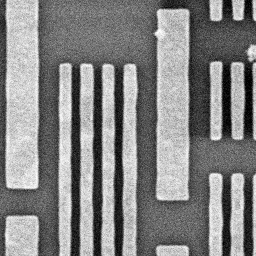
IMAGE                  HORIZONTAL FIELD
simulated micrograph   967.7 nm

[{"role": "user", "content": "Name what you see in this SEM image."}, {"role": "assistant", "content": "wiring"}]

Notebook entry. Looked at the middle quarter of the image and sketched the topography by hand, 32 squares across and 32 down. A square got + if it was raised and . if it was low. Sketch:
++..+++...++...+++.....++++++++.
++..+++...++...+++.....++++++++.
++..+++...++...+++.....++++++++.
++..+++...++...+++.....++++++++.
++..+++...++...+++.....++++++++.
++..+++...++...+++.....++++++++.
++..+++...++...+++.....++++++++.
++..+++...++...+++.....++++++++.
++..+++...++...+++.....++++++++.
++..+++...++...+++.....++++++++.
++..+++...++...+++.....++++++++.
++..+++...++...+++.....++++++++.
++..+++...++...+++.....++++++++.
++..+++...++...+++......+++++++.
++..+++...++...+++.....++++++++.
++..+++...+++..+++.....++++++++.
++..+++...+++..+++.....++++++++.
++..+++...++...+++.....++++++++.
++..+++...++...+++.....++++++++.
++..+++...++...+++.....++++++++.
++..+++...++...+++.....++++++++.
++..+++...++...+++.....++++++++.
++..+++...++...+++.....++++++++.
+...+++...++...+++.....++++++++.
+...+++...++...+++.....++++++++.
++..+++...++...+++.....++++++++.
++..+++...++...+++.....++++++++.
++..+++...++...+++.....++++++++.
++..+++...++...+++.....++++++++.
++..+++...++...+++.....++++++++.
++..+++...++...+++.....++++++++.
++..+++...++...+++.....++++++++.